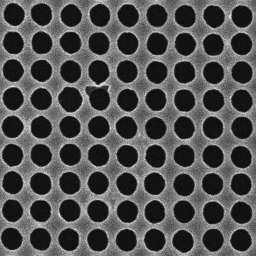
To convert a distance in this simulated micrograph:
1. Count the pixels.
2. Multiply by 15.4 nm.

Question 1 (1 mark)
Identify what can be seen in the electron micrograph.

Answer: a regular array of holes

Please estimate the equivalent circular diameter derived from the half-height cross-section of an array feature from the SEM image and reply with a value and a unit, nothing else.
339 nm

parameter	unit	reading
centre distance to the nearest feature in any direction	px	27.7